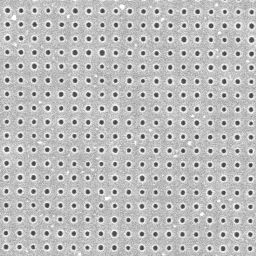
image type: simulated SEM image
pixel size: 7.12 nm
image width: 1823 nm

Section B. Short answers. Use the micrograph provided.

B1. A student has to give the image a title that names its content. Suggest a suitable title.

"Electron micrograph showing a regular array of holes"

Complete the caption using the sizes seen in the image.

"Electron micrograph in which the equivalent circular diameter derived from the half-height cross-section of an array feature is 34.1 nm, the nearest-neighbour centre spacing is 95 nm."